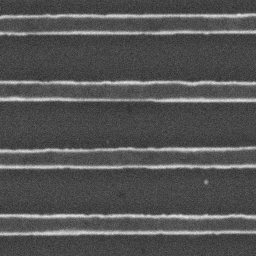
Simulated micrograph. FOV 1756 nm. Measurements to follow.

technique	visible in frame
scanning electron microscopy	lines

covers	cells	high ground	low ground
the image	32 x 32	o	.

................................
................................
oooooooooooooooooooooooooooooooo
oooooooooooooooooooooooooooooooo
................................
................................
................................
................................
................................
................................
oooooooooooooooooooooooooooooooo
oooooooooooooooooooooooooooooooo
.......o.ooooooooooooooooooooooo
................................
................................
................................
................................
................................
...............................o
oooooooooooooooooooooooooooooooo
oooooooooooooooooooooooooooooooo
................................
................................
................................
................................
................................
................................
oooooooooooooooooooooooooooooooo
oooooooooooooooooooooooooooooooo
................................
................................
................................